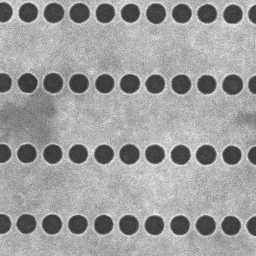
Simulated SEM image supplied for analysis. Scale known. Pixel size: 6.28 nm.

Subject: a regular array of holes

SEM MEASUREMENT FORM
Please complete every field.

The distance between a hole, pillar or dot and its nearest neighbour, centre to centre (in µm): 0.16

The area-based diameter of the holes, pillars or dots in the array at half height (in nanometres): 120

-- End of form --